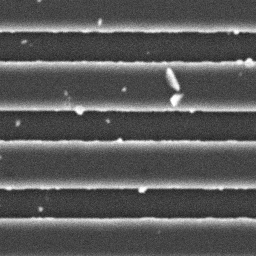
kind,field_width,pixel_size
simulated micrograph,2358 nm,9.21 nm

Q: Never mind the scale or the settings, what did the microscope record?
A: lines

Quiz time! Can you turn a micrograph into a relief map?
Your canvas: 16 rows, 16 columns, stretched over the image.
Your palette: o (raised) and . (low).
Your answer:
oooooooooooooooo
oooooooooooooooo
................
................
oooooooooooooooo
oooooooooooooooo
oooooooooooooooo
................
................
oooooooooooooooo
oooooooooooooooo
oooooooooooooooo
................
................
oooooooooooooooo
oooooooooooooooo